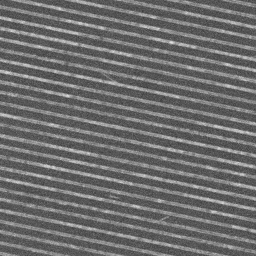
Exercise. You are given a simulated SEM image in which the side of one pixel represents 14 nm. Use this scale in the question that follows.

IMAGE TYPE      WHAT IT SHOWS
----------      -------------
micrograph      parallel lines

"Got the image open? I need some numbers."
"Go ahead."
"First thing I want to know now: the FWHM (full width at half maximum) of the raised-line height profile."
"27.4 nm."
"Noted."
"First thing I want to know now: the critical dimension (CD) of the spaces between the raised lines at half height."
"118 nanometers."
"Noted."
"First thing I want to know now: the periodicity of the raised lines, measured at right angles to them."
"147 nm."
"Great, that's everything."